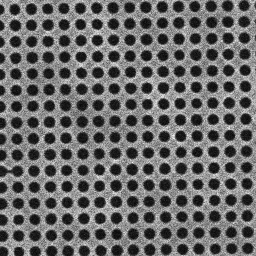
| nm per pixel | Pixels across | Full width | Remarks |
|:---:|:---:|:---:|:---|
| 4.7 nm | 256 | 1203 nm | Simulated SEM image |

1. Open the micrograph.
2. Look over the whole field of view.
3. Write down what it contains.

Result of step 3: a regular array of holes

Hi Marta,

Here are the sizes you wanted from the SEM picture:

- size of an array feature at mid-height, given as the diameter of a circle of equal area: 10.9 px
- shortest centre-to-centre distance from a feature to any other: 74.6 nm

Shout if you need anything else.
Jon